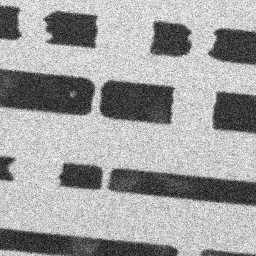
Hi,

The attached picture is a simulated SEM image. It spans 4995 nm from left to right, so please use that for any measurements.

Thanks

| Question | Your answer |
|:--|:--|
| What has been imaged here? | one or a few lines or trenches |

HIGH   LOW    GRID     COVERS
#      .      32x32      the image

################################
...###....######################
..###.......####################
..####......#######.....###..###
...###......#######.....###.....
######......#######.....###.....
###################.....##......
###########################.....
################################
..........######################
............#.......############
......................#####...##
......................#####.....
......................#####.....
##########.##.........####......
####################.######.....
#############################...
################################
################################
.###############################
..######..######################
.#######.....#......############
..#####......#................##
#########.......................
###################.............
############################....
################################
################################
.###############################
..........######################
....................############
##....................###.....##